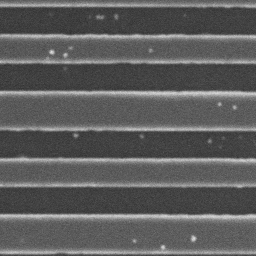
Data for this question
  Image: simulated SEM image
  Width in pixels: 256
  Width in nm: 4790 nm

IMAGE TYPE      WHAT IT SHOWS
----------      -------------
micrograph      lines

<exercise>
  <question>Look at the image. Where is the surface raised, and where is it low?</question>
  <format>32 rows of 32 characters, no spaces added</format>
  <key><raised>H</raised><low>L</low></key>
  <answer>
HHHHHHHHHHHHHHHHHHHHHHHHHHHHHHHH
LLLLLLLLLLLLLLLLLLLLLLLLLLLLLLLL
LLLLLLLLLLLLLLLLLLLLLLLLLLLLLLLL
LLLLLLLLLLLLLLLLLLLLLLLLLLLLLLLL
HHHHHHHHHHHHHHHHHHHHHHHHHHHHHHHH
HHHHHHHHHHHHHHHHHHHHHHHHHHHHHHHH
HHHHHHHHHHHHHHHHHHHHHHHHHHHHHHHH
HHHHHHHHHHHHHHHHHHHHHHHHHHHHHHHH
LLLLLLLLLLLLLLLLLLLLLLLLLLLLLLLL
LLLLLLLLLLLLLLLLLLLLLLLLLLLLLLLL
LLLLLLLLLLLLLLLLLLLLLLLLLLLLLLLL
HHHHHHHHHHHHHHHHHHLLLLLHLLLLLLLL
HHHHHHHHHHHHHHHHHHHHHHHHHHHHHHHH
HHHHHHHHHHHHHHHHHHHHHHHHHHHHHHHH
HHHHHHHHHHHHHHHHHHHHHHHHHHHHHHHH
HHHHHHHHHHHHHHHHHHHHHHHHHHHHHHHH
LLLLLLLLLLLLLLLLLLLLLLLLLLLLLLLL
LLLLLLLLLLLLLLLLLLLLLLLLLLLLLLLL
LLLLLLLLLLLLLLLLLLLLLLLLLLLLLLLL
LLLLLLLLLLLLLLLLLLLLLLLLLLLLLLLL
HHHHHHHHHHHHHHHHHHHHHHHHHHHHHHHH
HHHHHHHHHHHHHHHHHHHHHHHHHHHHHHHH
HHHHHHHHHHHHHHHHHHHHHHHHHHHHHHHH
LLLLLLLLLLLLLLLLLLLLLLLLLLLLLLLL
LLLLLLLLLLLLLLLLLLLLLLLLLLLLLLLL
LLLLLLLLLLLLLLLLLLLLLLLLLLLLLLLL
LLLLLLLLLLLLLLLLLLLLLLLLLLLLLLLL
HHHHHHHHHHHHHHHHHHHHHHHHHHHHHHHH
HHHHHHHHHHHHHHHHHHHHHHHHHHHHHHHH
HHHHHHHHHHHHHHHHHHHHHHHHHHHHHHHH
HHHHHHHHHHHHHHHHHHHHHHHHHHHHHHHH
HHHHHHHHHHHHHHHHHHHHHHHHHHHHHHHH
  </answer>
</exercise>